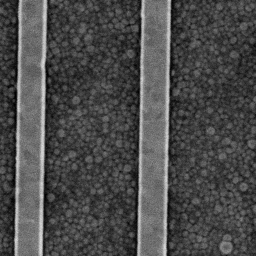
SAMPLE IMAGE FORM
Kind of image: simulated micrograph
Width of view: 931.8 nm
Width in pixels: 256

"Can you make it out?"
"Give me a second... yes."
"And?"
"one or a few lines or trenches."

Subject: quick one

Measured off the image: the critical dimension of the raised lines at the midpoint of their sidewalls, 93.4 nm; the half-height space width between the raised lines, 354 nm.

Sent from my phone